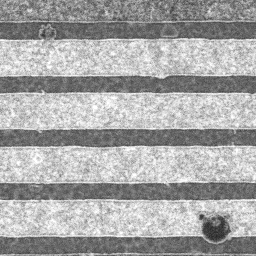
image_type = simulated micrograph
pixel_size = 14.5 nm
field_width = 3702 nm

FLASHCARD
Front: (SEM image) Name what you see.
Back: parallel lines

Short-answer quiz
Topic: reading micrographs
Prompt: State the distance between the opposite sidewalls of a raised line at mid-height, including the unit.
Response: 515 nanometers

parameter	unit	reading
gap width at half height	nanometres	257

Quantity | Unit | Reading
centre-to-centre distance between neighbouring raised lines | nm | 778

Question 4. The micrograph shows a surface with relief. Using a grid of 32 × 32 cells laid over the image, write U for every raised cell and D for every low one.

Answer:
UUUUUUUUUUUUUUUUUUUUUUUUUUUUUUUU
UUUUUUUUUUUUUUUUUUUUUUUUUUUUUUUU
UUUUUUUUUUUUUUUUUUUUUUUUUUUUUUUU
DDDDDUUDDDDDDDDDDDDDUUDDDDDDDDDD
DDDDDUUDDDDDDDDDDDDDUUDDDDDDDDDD
UUUUUUUUUUUUUUUUUUUUUUUUUUUUUUUU
UUUUUUUUUUUUUUUUUUUUUUUUUUUUUUUU
UUUUUUUUUUUUUUUUUUUUUUUUUUUUUUUU
UUUUUUUUUUUUUUUUUUUUUUUUUUUUUUUU
UDDDDUDDDDDDDDUDDDDUUDDDDDDDDDDD
DDDDDDDDDDDDDDDDDDDDDDDDDDDDDDDD
DDDDDDDDDDDDDDDDDDDDDDDUDDDDDDDD
UUUUUUUUUUUUUUUUUUUUUUUUUUUUUUUU
UUUUUUUUUUUUUUUUUUUUUUUUUUUUUUUU
UUUUUUUUUUUUUUUUUUUUUUUUUUUUUUUU
UUUUUUUUUUUUUUUUUUUUUUUUUUUUUUUU
DDDDDDDDDDDDDDDDDDDDDDDDDDDDDDDD
DDDDDDDDDDDDUUDDDDDDDDDDDDDDDDDD
UUUUUUUUUUUUUUUUUUUUUUUUUUUUUUUU
UUUUUUUUUUUUUUUUUUUUUUUUUUUUUUUU
UUUUUUUUUUUUUUUUUUUUUUUUUUUUUUUU
UUUUUUUUUUUUUUUUUUUUUUUUUUUUUUUU
UUUUUUUUUUUUUUUUUUUUUUUUUUUUUUUU
DDDDUDDDDDDDDDDDDDDDDDDDDDDDDDDD
UDDDDDDDDDDDDDDDDDDDDDDDDDDDDDDD
UUUUUUUUUUUUUUUUUUUUUUUUUUUUUUUU
UUUUUUUUUUUUUUUUUUUUUUUUUUUUUUUU
UUUUUUUUUUUUUUUUUUUUUUUUUUUUUUUU
UUUUUUUUUUUUUUUUUUUUUUUUUUUUUUUU
UUUUUUUUUUDDDDDUDDUUUDDDDUUUUUUD
DDDDDDDDDDDDDDDDDDDDDDDDDDDDDDDD
DDDDDDDDDDDDDDDDDUDDDDDDDDDDDDDD